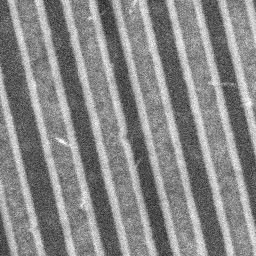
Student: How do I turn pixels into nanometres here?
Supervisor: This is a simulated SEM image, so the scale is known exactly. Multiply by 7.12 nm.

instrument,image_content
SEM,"parallel lines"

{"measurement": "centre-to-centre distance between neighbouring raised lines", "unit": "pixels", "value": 51.6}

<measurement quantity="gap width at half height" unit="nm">175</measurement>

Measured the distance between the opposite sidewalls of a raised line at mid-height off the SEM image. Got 199 nanometres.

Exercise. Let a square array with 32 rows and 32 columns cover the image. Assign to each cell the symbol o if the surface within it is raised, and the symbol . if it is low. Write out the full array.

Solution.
.oooo...oooo..oooo...oooo...ooo.
..ooo...oooo...ooo...oooo...oooo
..ooo....ooo...ooo....ooo...oooo
..oooo...ooo...oooo...oooo..oooo
..oooo...oooo..oooo...oooo...ooo
...ooo...oooo...ooo...oooo...ooo
...ooo....ooo...ooo....ooo...ooo
...oooo...ooo...oooo...oooo..ooo
...oooo...oooo..oooo...oooo...oo
....ooo...oooo...ooo...oooo...oo
....ooo....ooo...ooo....ooo...oo
....oooo...ooo...oooo...ooo...oo
o...oooo...oooo..oooo...oooo...o
o...oooo...oooo...ooo...oooo...o
o....ooo....ooo...ooo....ooo...o
o....oooo...ooo...oooo...ooo...o
oo...oooo...ooo...oooo...oooo...
oo....ooo...oooo...ooo...oooo...
oo....ooo...oooo...ooo....ooo...
oo....oooo...ooo...oooo...ooo...
ooo...oooo...ooo...oooo...oooo..
ooo....ooo...oooo..oooo...oooo..
ooo....ooo...oooo...ooo...oooo..
ooo....oooo...ooo...oooo...ooo..
ooo....oooo...ooo...oooo...oooo.
oooo...oooo...oooo..oooo...oooo.
oooo....ooo...oooo...ooo...oooo.
.ooo....oooo...ooo...oooo...ooo.
.ooo....oooo...ooo...oooo...oooo
.oooo...oooo...oooo..oooo...oooo
.oooo....ooo...oooo...ooo...oooo
..ooo....ooo....ooo...ooo....ooo